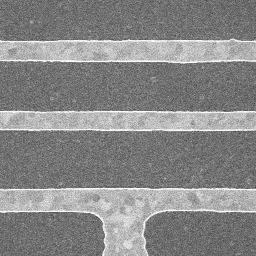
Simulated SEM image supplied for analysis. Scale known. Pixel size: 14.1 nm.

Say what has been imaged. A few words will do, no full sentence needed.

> one or a few lines or trenches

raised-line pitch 1040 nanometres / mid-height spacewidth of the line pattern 767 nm